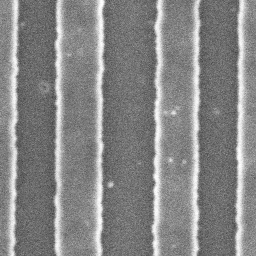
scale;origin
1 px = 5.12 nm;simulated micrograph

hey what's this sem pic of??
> lines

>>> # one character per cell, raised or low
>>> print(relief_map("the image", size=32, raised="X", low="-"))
XX-----XXXXXX-------XXXXX-----XX
XX-----XXXXXX-------XXXXX-----XX
XX-----XXXXXX-------XXXXX-----XX
XX-----XXXXXX------XXXXXX-----XX
XX-----XXXXXX-------XXXXX-----XX
XX-----XXXXXX-------XXXXX-----XX
XX-----XXXXXX-------XXXXX-----XX
XX-----XXXXXX-------XXXXX-----XX
XX-----XXXXXX-------XXXXX-----XX
XX-----XXXXXX-------XXXXX-----XX
XX-----XXXXXX------XXXXXX-----XX
XX-----XXXXXX-------XXXXX-----XX
XX-----XXXXXX-------XXXXX-----XX
XX-----XXXXXX------XXXXXX-----XX
XX-----XXXXXX------XXXXXX-----XX
XX-----XXXXXX-------XXXXX-----XX
XX-----XXXXXX-------XXXXX-----XX
XX-----XXXXXX------XXXXXX-----XX
XX-----XXXXXX------XXXXXX-----XX
XX-----XXXXXX------XXXXXX-----XX
XX-----XXXXXX------XXXXXX-----XX
XX-----XXXXXX------XXXXXX-----XX
XX-----XXXXXX------XXXXXX-----XX
XX-----XXXXXX------XXXXXX-----XX
XX-----XXXXXX------XXXXXX-----XX
XX-----XXXXXX------XXXXX------XX
XX-----XXXXXX------XXXXXX-----XX
XX-----XXXXXX------XXXXXX-----XX
XX-----XXXXXX------XXXXXX-----XX
XX-----XXXXX-------XXXXX------XX
XX-----XXXXXX------XXXXXX-----XX
XX-----XXXXXX------XXXXXX-----XX